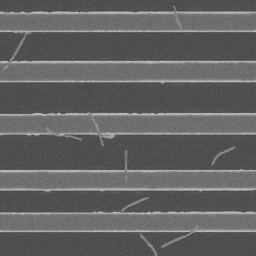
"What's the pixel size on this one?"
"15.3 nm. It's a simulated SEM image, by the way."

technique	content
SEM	lines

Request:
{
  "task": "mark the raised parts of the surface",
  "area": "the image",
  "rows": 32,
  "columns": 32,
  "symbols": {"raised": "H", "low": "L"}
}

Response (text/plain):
LLLLLLLLLLLLLLLLLLLLLLLLLLLLLLLL
LLLLLLLLLLLLLLLLLLLLLHLLLLLLLLLL
HHHHHHHHHHHHHHHHHHHHHHHHHHHHHHHH
HHHHHHHHHHHHHHHHHHHHHHHHHHHHHHHH
LLLLLLLLLLLLLLLLLLLLLLLLLLLLLLLL
LLLLLLLLLLLLLLLLLLLLLLLLLLLLLLLL
LLLLLLLLLLLLLLLLLLLLLLLLLLLLLLLL
LLLLLLLLLLLLLLLLLLLLLLLLLLLLLLLL
HHHHHHHHHHHHHHHHHHHHHHHHHHHHHHHH
HHHHHHHHHHHHHHHHHHHHHHHHHHHHHHHH
LLLLLLLLLLLLLLLLLLLLLLLLLLLLLLLL
LLLLLLLLLLLLLLLLLLLLLLLLLLLLLLLL
LLLLLLLLLLLLLLLLLLLLLLLLLLLLLLLL
LLLLLLLLLLLLLLLLLLLLLLLLLLLLLLLL
HHHHHHHHHHHHHHHHHHHHHHHHHHHHHHHH
HHHHHHHHHHHHHHHHHHHHHHHHHHHHHHHH
HHHHHHHHHHHHHHHHHHHHHHHHHHHHHHHH
LLLLLLLLLLLLLLLLLLLLLLLLLLLLLLLL
LLLLLLLLLLLLLLLLLLLLLLLLLLLLLLLL
LLLLLLLLLLLLLLLLLLLLLLLLLLLLLLLL
LLLLLLLLLLLLLLLLLLLLLLLLLLLLLLLL
HHHHHHHHHHHHHHHHHHHHHHHHHHHHHHHH
HHHHHHHHHHHHHHHHHHHHHHHHHHHHHHHH
HHHHHHHHHHHHHHHHHHHHHHHHHHHHHHHH
LLLLLLLLLLLLLLLLLLLLLLLLLLLLLLLL
LLLLLLLLLLLLLLLLLLLLLLLLLLLLLLLL
LLLLLLLLLLLLLLLLLLLLLLLLLLLLLLLL
HHHHHHHHHHHHHHHHHHHHHHHHHHHHHHHH
HHHHHHHHHHHHHHHHHHHHHHHHHHHHHHHH
LLLLLLLLLLLLLLLLLLLLLLLLLLLLLLLL
LLLLLLLLLLLLLLLLLLLLLLLLLLLLLLLL
LLLLLLLLLLLLLLLLLLLLLLLLLLLLLLLL